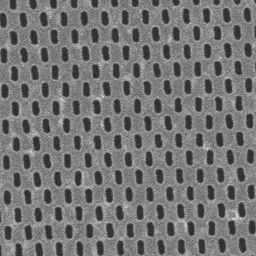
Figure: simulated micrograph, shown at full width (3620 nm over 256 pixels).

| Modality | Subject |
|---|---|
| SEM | a regular array of holes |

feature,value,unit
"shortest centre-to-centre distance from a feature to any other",283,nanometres